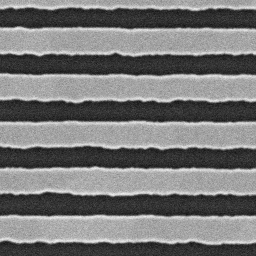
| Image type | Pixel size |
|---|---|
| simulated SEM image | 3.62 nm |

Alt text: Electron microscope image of lines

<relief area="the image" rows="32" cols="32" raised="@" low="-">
@@@@@@@@@@@@@@@@@@@@@@@@@@@@@@@@
--------------------------------
--------------------------------
--@-----------------------------
@@@@@@@@@@@@@@@@@@@@@@@@@@@@@@@@
@@@@@@@@@@@@@@@@@@@@@@@@@@@@@@@@
@@@@@@@@@@@@@@@@@@@@@@@@@@@@@@@@
--------------------------------
--------------------------------
@@@@@@@@@@@@@@@@@@@-@@@@@@@@@@@@
@@@@@@@@@@@@@@@@@@@@@@@@@@@@@@@@
@@@@@@@@@@@@@@@@@@@@@@@@@@@@@@@@
---@@@@@@@@@@@@@@@@@@@-@@@@@@@@@
--------------------------------
--------------------------------
@@@@@@@@@@@@@@@@@@@@@@@@@@@@@@@@
@@@@@@@@@@@@@@@@@@@@@@@@@@@@@@@@
@@@@@@@@@@@@@@@@@@@@@@@@@@@@@@@@
--@-----------@-@---@-----@@@--@
--------------------------------
--------------------------------
@@@@@@@@@@@@@@@@@@@@@@@@@@@@@@@@
@@@@@@@@@@@@@@@@@@@@@@@@@@@@@@@@
@@@@@@@@@@@@@@@@@@@@@@@@@@@@@@@@
--------------------------------
--------------------------------
--------------------------------
@@@@@@@@@@@@@@@@@@@@@@@@@@@@@@@@
@@@@@@@@@@@@@@@@@@@@@@@@@@@@@@@@
@@@@@@@@@@@@@@@@@@@@@@@@@@@@@@@@
--------------------------@@----
--------------------------------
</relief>